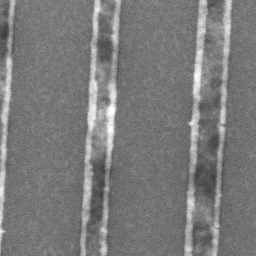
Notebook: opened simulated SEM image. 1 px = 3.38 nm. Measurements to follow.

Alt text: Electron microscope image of one or a few lines or trenches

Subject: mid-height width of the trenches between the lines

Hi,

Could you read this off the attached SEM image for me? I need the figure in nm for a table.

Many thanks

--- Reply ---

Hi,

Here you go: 278